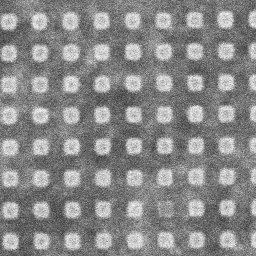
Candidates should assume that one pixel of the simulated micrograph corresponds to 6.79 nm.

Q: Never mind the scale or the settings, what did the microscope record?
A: a regular array of raised bodies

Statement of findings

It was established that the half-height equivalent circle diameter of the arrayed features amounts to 103 nm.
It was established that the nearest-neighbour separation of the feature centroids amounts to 0.209 microns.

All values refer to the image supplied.